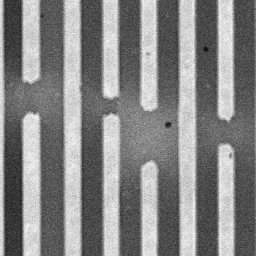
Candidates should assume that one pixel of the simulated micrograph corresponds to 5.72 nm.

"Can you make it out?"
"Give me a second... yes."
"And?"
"parallel lines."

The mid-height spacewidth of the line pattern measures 130 nanometres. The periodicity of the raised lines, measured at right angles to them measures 223 nm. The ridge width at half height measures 92.3 nm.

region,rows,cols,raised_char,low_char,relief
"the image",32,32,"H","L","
LLLHHLLLHHLLLHHLLLHHLLHHLLLHHLLL
LLLHHLLLHHLLLHHLLLHHLLHHLLLHHLLL
LLLHHLLLHHLLLHHLLLHHLLHHLLLHHLLL
LLLHHLLLHHLLLHHLLLHHLLHHLLLHHLLL
LLLHHLLLHHLLLHHLLLHHLLHHLLLHHLLL
LLLHHLLLHHLLLHHLLLHHLLHHLLLHHLLL
LLLHHLLLHHLLLHHLLLHHLLHHLLLHHLLL
LLLHHLLLHHLLLHHLLLHHLLLHLLLHHLLL
LLLHHLLLHHLLLHHLLLHHLLLHLLLHHLLL
LLLHHLLLHHLLLHHLLLHHLLHHLLLHHLLL
LLLLLLLLHHLLLHHLLLHHLLHHLLLHHLLL
LLLLLLLLHHLLLHHLLLHHLLHHLLLHHLLL
LLLLLLLLHHLLLLLLLLHHLLHHLLLHHLLL
LLLLLLLLHHLLLLLLLLHLLLHHLLLHHLLL
LLLHHLLLHHLLLLLLLLLLLLHHLLLLHLLL
LLLHHLLLHHLLLHHLLLLLLLHHLLLLLLLL
LLLHHLLLHHLLLHHLLLLLLLHHLLLLLLLL
LLLHHLLLHHLLLHHLLLLLLLHHLLLLLLLL
LLLHHLLLHHLLLHHLLLLLLLHHLLLHHLLL
LLLHHLLLHHLLLHHLLLLLLLHHLLLHHLLL
LLLHHLLLHHLLLHHLLLHLLLHHLLLHHLLL
LLLHHLLLHHLLLHHLLLHHLLHHLLLHHLLL
LLLHHLLLHHLLLHHLLLHHLLHHLLLHHLLL
LLLHHLLLHHLLLHHLLLHHLLHHLLLHHLLL
LLLHHLLLHHLLLHHLLLHHLLHHLLLHHLLL
LLLHHLLLHHLLLHHLLLHHLLHHLLLHHLLL
LLLHHLLLHHLLLHHLLLHHLLHHLLLHHLLL
LLLHHLLLHHLLLHHLLLHHLLHHLLLHHLLL
LLLHHLLLHHLLLHHLLLHHLLHHLLLHHLLL
LLLHHLLLHHLLLHHLLLHHLLHHLLLHHLLL
LLLHHLLLHHLLLHHLLLHHLLLHLLLHHLLL
LLLHHLLLHHLLLHHLLLHHLLLHLLLHHLLL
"